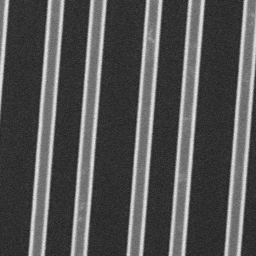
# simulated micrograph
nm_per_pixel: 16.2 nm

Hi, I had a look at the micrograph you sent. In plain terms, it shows parallel lines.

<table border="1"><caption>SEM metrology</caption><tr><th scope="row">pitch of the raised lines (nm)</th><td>784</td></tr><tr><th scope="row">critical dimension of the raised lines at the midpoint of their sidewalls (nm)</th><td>194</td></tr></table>